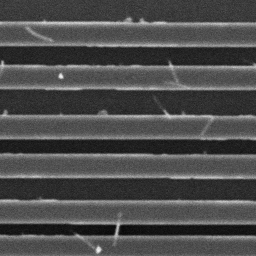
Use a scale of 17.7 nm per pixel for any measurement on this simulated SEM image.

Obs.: lines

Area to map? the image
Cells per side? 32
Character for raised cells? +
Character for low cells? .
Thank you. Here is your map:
................................
................................
................................
++++++++++++++++++++++++++++++++
++++++++++++++++++++++++++++++++
++++++++++++++++++++++++++++++++
................................
................................
++++++++++++++++++++++++++++++++
++++++++++++++++++++++++++++++++
++++++++++++++++++++++++++++++++
................................
................................
................................
+++++++++++++++++++++++++++...++
++++++++++++++++++++++++++++++++
++++++++++++++++++++++++++++++++
................................
................................
++++++++++++++++++++++++++++++++
++++++++++++++++++++++++++++++++
++++++++++++++++++++++++++++++++
................................
................................
................................
++++++++++++++++++++++++++++++++
++++++++++++++++++++++++++++++++
++++++++++++++++++++++++++++++++
................................
++++++.+.+....+.................
++++++++++++++++++++++++++++++++
++++++++++++++++++++++++++++++++